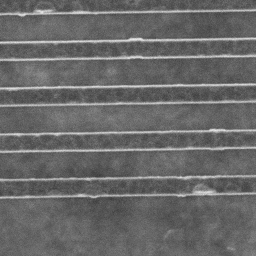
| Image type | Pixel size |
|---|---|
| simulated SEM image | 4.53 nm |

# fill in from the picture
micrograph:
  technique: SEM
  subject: parallel lines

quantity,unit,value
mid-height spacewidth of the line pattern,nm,124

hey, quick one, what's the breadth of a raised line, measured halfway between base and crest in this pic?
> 83.8 nanometers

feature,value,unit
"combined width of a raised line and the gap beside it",0.207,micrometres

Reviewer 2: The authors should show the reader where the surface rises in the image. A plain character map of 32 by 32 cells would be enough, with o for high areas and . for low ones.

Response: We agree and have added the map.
oooooooooooooooooooooooooooooooo
oooooooooooooooooooooo..........
................................
................................
................................
oooooooooooooooooooooooooooooooo
oooooooooooooooooooooooooooooooo
.oo.............................
................................
................................
................................
oooooooooooooooooooooooooooooooo
oooooooooooooooooooooooooooooooo
................................
................................
................................
..................oooooooooooooo
oooooooooooooooooooooooooooooooo
oooooooooooooooooooooooooooo....
................................
................................
................................
oooooooooooooooooooooooooooooooo
oooooooooooooooooooooooooooooooo
ooooooooooooo...................
................................
................................
................................
................................
................................
................................
................................